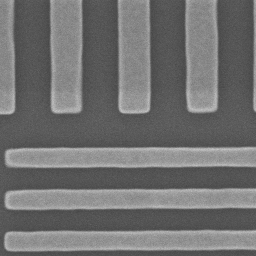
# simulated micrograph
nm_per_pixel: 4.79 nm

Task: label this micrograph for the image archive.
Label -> groups of lines, slits or small figures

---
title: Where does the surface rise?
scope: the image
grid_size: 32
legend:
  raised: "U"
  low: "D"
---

UUDDDDUUUUDDDDDUUUUDDDDUUUUDDDDD
UUDDDDUUUUDDDDDUUUUDDDDUUUUDDDDD
UUDDDDUUUUDDDDDUUUUDDDDUUUUDDDDD
UDDDDDUUUUDDDDDUUUUDDDDUUUUDDDDD
UUDDDDUUUUDDDDDUUUUDDDDUUUUDDDDD
UUDDDDUUUUDDDDDUUUUDDDDUUUUDDDDD
UUDDDDUUUUDDDDDUUUUDDDDUUUUDDDDD
UUDDDDDUUUDDDDDUUUUDDDDUUUUDDDDD
UUDDDDDUUUDDDDDUUUUDDDDUUUUDDDDD
UUDDDDDUUUDDDDDUUUUDDDDUUUUDDDDD
UUDDDDDUUUDDDDDUUUUDDDDUUUUDDDDD
UUDDDDDUUUDDDDDUUUUDDDDUUUUDDDDD
UUDDDDDUUUDDDDDUUUUDDDDUUUUDDDDD
UUDDDDDUUUDDDDDUUUUDDDDDUUUDDDDD
DDDDDDDDDDDDDDDDDDDDDDDDDDDDDDDD
DDDDDDDDDDDDDDDDDDDDDDDDDDDDDDDD
DDDDDDDDDDDDDDDDDDDDDDDDDDDDDDDD
DDDDDDDDDDDDDDDDDDDDDDDDDDDDDDDD
DDDDDDDDDDDDDDDDDDUUUDDDDDDDDDUU
DUUUUUUUUUUUUUUUUUUUUUUUUUUUUUUU
DUUUUUUUUUUUUUUUUUUUUUUUUUUUUUUU
DDDDDDDDDDDDDDDDDDDDDDDDDDDDDDDD
DDDDDDDDDDDDDDDDDDDDDDDDDDDDDDDD
DDDDDDDDDDDDDDDDDDDDDDDDDDDDDDDD
DUUUUUUUUUUUUUUUUUUUUUUUUUUUUUUU
DUUUUUUUUUUUUUUUUUUUUUUUUUUUUUUU
DDDDDDDDDDDDDDDDDDDDDDDDDDDDDDDD
DDDDDDDDDDDDDDDDDDDDDDDDDDDDDDDD
DDDDDDDDDDDDDDDDDDDDDDDDDDDDDDDD
DUUUUUUUUUUUUUUUUUUUUUUUUUUUUUUU
DUUUUUUUUUUUUUUUUUUUUUUUUUUUUUUU
DDDDDDDDDDDDDDDDDDDDDDDDDDDDDDDD